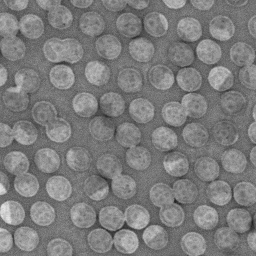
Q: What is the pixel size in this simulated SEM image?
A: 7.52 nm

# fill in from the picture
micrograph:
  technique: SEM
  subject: a regular array of raised bodies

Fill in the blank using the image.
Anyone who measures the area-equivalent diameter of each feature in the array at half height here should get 181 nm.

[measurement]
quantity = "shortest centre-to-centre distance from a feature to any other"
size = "210 nm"